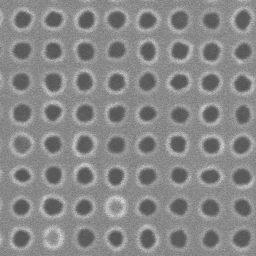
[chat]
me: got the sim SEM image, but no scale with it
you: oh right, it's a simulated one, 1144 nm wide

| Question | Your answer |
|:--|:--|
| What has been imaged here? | a regular array of holes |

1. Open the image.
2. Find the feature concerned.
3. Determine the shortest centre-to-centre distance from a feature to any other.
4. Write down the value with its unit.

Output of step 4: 137 nm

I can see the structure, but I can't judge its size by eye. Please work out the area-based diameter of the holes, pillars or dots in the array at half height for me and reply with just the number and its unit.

79 nm